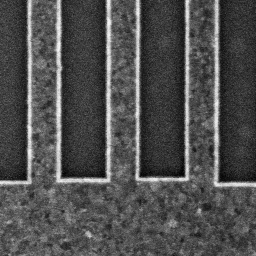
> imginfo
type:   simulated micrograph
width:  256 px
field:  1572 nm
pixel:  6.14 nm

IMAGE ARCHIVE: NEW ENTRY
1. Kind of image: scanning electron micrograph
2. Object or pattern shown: one or a few lines or trenches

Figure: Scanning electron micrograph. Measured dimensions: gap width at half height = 303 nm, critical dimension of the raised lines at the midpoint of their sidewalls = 177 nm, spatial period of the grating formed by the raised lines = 78.7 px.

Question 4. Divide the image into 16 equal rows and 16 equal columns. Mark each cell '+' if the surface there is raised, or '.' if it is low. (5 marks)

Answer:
..++...++...++..
..++...++...++..
..++...++...++..
..++...++...++..
..++...++...++..
..++...++...++..
..++...++...++..
..++...++...++..
..++...++...++..
..++...++...++..
..++...++...++..
++++++++++++++..
++++++++++++++++
++++++++++++++++
++++++++++++++++
++++++++++++++++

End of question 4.